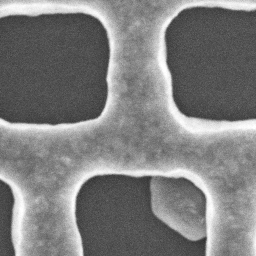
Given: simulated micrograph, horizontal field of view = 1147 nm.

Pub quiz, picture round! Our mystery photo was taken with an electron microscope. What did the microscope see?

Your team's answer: holes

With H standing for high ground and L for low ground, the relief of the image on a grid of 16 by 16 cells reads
HHHHHHHHHHHHLLLL
LLLLLLHHHHHLLLLL
LLLLLLLHHHLLLLLL
LLLLLLLHHHLLLLLL
LLLLLLLHHHHLLLLL
LLLLLLLHHHHLLLLL
LLLLLLLHHHHLLLLL
LLLLLLHHHHHHLLLL
HHHHHHHHHHHHHHHH
HHHHHHHHHHHHHHHH
HHHHHHHHHHHHHHHH
HHHHHLLLLLLLHHHH
LHHHHLLLLLLLLHHH
LHHHHLLLLLLLLHHH
LHHHHLLLLLLLLHHH
LHHHHLLLLLLLLHHH